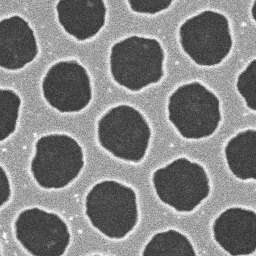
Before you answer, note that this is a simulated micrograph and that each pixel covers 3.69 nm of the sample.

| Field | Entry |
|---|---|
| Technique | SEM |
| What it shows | a regular array of holes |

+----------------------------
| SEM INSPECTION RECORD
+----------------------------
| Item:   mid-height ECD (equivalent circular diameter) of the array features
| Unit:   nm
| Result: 197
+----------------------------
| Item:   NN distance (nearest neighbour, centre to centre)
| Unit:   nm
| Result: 270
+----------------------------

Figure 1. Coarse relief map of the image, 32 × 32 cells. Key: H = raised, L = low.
HHHHHHHLLLLLLHHHLLLLLHHHHHHHHHHH
HHHHHHHLLLLLLHHHHLLLHHHHHLLHHHHL
LLLHHHHLLLLLLHHHHHHHHHHLLLLLHHHH
LLLLHHHHLLLLLHHHHHHHHHHLLLLLLHHH
LLLLHHHHHLLLHHHHHHHHHHLLLLLLLHHH
LLLLLHHHHHHHHHLLLLLLHHHLLLLLLHHH
LLLLLHHHHHHHHHLLLLLLHHHLLLLLLHHH
LLLLHHHHHHHHHHLLLLLLHHHHLLLLHHHH
HLLHHHLLLLHHHHLLLLLLHHHHHHHHHHHL
HHHHHHLLLLLHHHLLLLLLHHHHHHHHHHLL
HHHHHLLLLLLHHHHLLLLHHHHLLHHHHHLL
LLHHHLLLLLLHHHHHHHHHHHLLLLHHHHLL
LLLHHHLLLLLHHHHHHHHHHLLLLLLHHHHL
LLHHHHHLLLHHHHLLLHHHHLLLLLLHHHHL
LLHHHHHHHHHHHLLLLLHHHLLLLLLLHHHH
LLHHHHHHHHHHLLLLLLHHHHLLLLLHHHHH
LLHHHHHHHHHHLLLLLLLHHHLLLLLHHHLL
HHHHHLLLLHHHLLLLLLLHHHHHHHHHHLLL
HHHHLLLLLLHHHLLLLLHHHHHHHHHHLLLL
HHHHLLLLLLHHHHLLLLHHHHHHHHHHLLLL
HHHHLLLLLLHHHHHHHHHHHLLLLHHHLLLL
LHHHLLLLLLHHHHHHHHHLLLLLLLHHHLLL
LHHHHLLLLHHHHHHHHHHLLLLLLLHHHHHH
LHHHHHLLHHHHLLLLHHHLLLLLLLHHHHHH
LHHHHHHHHHHLLLLLLHHHLLLLLLHHHHHH
HHHHHHHHHHHLLLLLLHHHHLLLLHHHHHHH
HHHLLLHHHHHLLLLLLHHHHHHHHHHHLLLL
HHLLLLLLHHHLLLLLLHHHHHHHHHHLLLLL
HHLLLLLLHHHHLLLLLHHHHHHHHHHLLLLL
HHLLLLLLLHHHHLLLHHHLLLLHHHHLLLLL
HHHLLLLLLHHHHHHHHHLLLLLLHHHLLLLL
HHHHLLLLHHHHHHHHHHLLLLLLHHHHLLLL